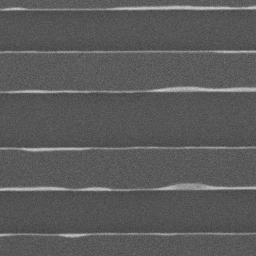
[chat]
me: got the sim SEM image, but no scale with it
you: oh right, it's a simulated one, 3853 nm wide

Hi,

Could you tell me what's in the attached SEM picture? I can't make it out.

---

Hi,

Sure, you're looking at groups of lines, slits or small figures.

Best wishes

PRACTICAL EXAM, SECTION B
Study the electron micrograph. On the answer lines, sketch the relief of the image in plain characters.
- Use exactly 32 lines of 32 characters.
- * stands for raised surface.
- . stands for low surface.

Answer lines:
********************************
................................
................................
................................
................................
................................
.........................**.....
********************************
********************************
********************************
********************************
*...............................
................................
................................
................................
................................
................................
................................
................****************
********************************
********************************
********************************
********************************
**********************....*****.
................................
................................
................................
................................
................................
********************************
********************************
********************************